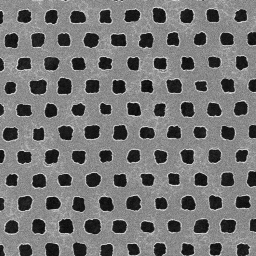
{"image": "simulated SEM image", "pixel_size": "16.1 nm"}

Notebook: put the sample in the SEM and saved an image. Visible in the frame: a regular array of holes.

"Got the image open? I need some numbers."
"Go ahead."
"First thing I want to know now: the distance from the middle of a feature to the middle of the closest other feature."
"0.423 micrometres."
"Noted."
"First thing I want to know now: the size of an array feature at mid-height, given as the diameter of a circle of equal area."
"233 nm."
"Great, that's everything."